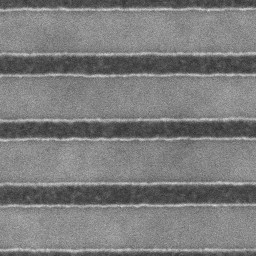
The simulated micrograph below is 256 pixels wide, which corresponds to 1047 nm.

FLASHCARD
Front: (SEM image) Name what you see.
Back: lines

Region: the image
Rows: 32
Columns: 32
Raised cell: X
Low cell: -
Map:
XXXXXXXXXXXXXXXXXXXXXXXXXXXXXXXX
--------------------------------
--------------------------------
--------------------------------
--------------------------------
--------------------------------
--------------------------------
XXXXXXXXXXXXXXXXXXXXXXXXXXXXXXXX
XXXXXXXXXXXXXXXXXXXXXXXXXXXXXXXX
X----------X---X----------------
--------------------------------
--------------------------------
--------------------------------
--------------------------------
--------------------------------
XXXXXXXXXXXXXXXXXXXXXXXXXXXXXXXX
XXXXXXXXXXXXXXXXXXXXXXXXXXXXXXXX
X-------------------------------
--------------------------------
--------------------------------
--------------------------------
--------------------------------
--------------------------------
XXXXXXXXXXXXXXXXXXXXXXXXXXXXXXXX
XXXXXXXXXXXXXXXXXXXXXXXXXXXXXXXX
XXXXXXXXXXXXXXXXXXXXXXXXXXXXXXXX
--------------------------------
--------------------------------
--------------------------------
--------------------------------
--------------------------------
XXXXXXXXXXXXXXXXXXXXXXXXXXXXXXXX